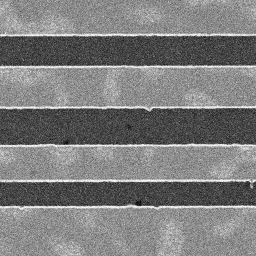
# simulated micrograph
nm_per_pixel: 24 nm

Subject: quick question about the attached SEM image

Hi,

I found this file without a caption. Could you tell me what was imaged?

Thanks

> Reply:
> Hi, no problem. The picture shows one or a few lines or trenches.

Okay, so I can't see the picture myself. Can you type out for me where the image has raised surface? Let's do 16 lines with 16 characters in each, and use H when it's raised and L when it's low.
HHHHHHHHHHHHHHHH
HHHHHHHHHHHHHHHH
LLLLLLLLLLLLLLLL
LLLLLLLLLLLLLLLL
HHHHHHHHHHHHHHHH
HHHHHHHHHHHHHHHH
HHHHHHHHHHHHHHHH
LLLLLLLLLLLLLLLL
LLLLLLLLLLLLLLLL
HHHHHHHHHHHHHHHH
HHHHHHHHHHHHHHHH
LLLLLLLLLLLLLLLL
LLLLLLLLLLLLLLLL
HHHHHHHHHHHHHHHH
HHHHHHHHHHHHHHHH
HHHHHHHHHHHHHHHH